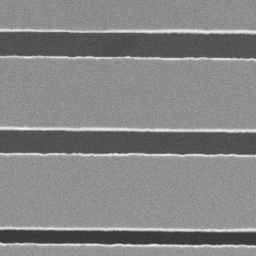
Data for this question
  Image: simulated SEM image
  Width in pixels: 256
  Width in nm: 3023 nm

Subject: lines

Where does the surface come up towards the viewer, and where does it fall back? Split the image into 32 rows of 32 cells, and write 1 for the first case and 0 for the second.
11111111111111111111111111111111
11111111111111111111111111111111
11111111111111111111111111111111
11111111111111111111111111111111
00000000000000000000000000000000
00000000000000000000000000000000
00000000000000000000000000000000
11111111111111111111111111111111
11111111111111111111111111111111
11111111111111111111111111111111
11111111111111111111111111111111
11111111111111111111111111111111
11111111111111111111111111111111
11111111111111111111111111111111
11111111111111111111111111111111
11111111111111111111111111111111
00000000000000000000000000000000
00000000000000000000000000000000
00000000000000000000000000000000
11111111111111111111111111111111
11111111111111111111111111111111
11111111111111111111111111111111
11111111111111111111111111111111
11111111111111111111111111111111
11111111111111111111111111111111
11111111111111111111111111111111
11111111111111111111111111111111
11111111111111111111111111111111
11111111111111111111111111111111
00000000000000000000000000000000
11111000000000000000000000000000
11111111111111111111111111111111